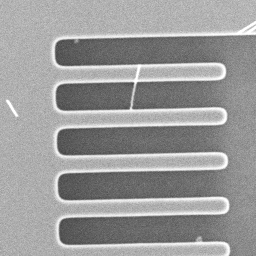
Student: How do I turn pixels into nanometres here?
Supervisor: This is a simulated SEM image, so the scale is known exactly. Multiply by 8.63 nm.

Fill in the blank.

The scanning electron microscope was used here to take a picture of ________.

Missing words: groups of lines, slits or small figures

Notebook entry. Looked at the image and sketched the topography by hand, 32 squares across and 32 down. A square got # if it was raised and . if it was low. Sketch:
################################
################################
################################
################################
######################..........
#######.........................
#######.........................
#######.........................
############################....
############################....
########........................
#######.........................
#######.........................
#######.........................
############################....
############################....
#######.........................
#######.........................
#######.........................
#########.##################....
############################....
#########.......................
#######.........................
#######.........................
#######.........................
#############################...
############################....
########........................
#######.........................
#######.........................
########.........###########....
#############################...